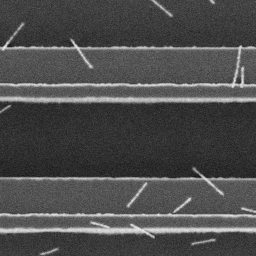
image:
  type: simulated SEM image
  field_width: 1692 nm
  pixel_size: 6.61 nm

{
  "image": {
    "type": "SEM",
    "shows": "lines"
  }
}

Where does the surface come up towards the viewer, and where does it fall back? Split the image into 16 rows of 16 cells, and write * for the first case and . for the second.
................
................
................
****************
****************
****************
................
................
................
................
................
****************
****************
****************
................
................